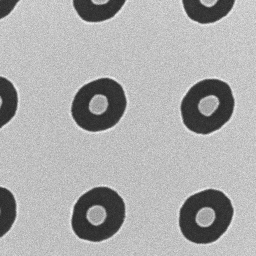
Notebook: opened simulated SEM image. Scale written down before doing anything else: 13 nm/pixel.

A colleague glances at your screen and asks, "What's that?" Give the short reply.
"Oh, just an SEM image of ring-shaped grooves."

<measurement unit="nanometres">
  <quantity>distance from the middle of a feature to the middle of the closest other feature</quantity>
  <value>1400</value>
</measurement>